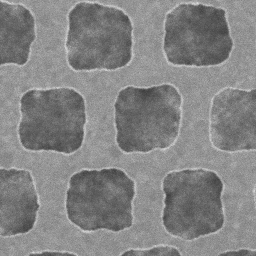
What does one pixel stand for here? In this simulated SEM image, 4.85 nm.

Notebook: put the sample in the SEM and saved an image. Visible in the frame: holes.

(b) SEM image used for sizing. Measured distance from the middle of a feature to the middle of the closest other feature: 454 nm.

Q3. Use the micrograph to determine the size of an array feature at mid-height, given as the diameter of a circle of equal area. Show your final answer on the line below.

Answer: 339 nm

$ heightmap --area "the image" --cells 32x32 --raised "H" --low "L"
LLHHHHHHHHLLLHHHHHHHHHHLHHHHHHHH
LLLLHHHHHLLLLLLHHHHHHLLLLLLLHHHH
LLLLHHHHHLLLLLLLHHHHHLLLLLLLHHHH
LLLLHHHHHLLLLLLLLHHHHLLLLLLLLHHH
LLLLHHHHLLLLLLLLLHHHLLLLLLLLLHHH
LLLLHHHHLLLLLLLLLHHHLLLLLLLLLHHH
LLLLHHHHLLLLLLLLLHHHHLLLLLLLLHHH
LLLHHHHHLLLLLLLLHHHHHLLLLLLLHHHH
HHHHHHHHHLLLLLLHHHHHHHHHHHHHHHHH
HHHHHHHHHHHHHHHHHHHHHHHHHHHHHHHH
HHHHHHHHHHHHHHHHHHHHHHHHHHHHHHHH
HHHLLLLLLLHHHHHLLLLLLLHHHHHLLLLL
HHHLLLLLLLLHHHLLLLLLLLLHHHHLLLLL
HHLLLLLLLLLHHHLLLLLLLLLHHHLLLLLL
HHHLLLLLLLLHHHLLLLLLLLLHHHLLLLLL
HHLLLLLLLLLHHHLLLLLLLLLHHHLLLLLL
HHLLLLLLLLLHHHHLLLLLLLHHHHLLLLLL
HHLLLLLLLLHHHHHLLLLLLLHHHHLLLLLL
HHHLLLLLLLHHHHHLLLLLHHHHHHHLLLLL
HHHHHHHHHHHHHHHHHHHHHHHHHHHHHHHH
HHHHHHHHHHHHHHHHHHHHHHHHHHHHHHHH
LLLHHHHHHHLLLLLLHHHHHLLLLLLHHHHH
LLLLHHHHHLLLLLLLLHHHLLLLLLLLHHHH
LLLLHHHHLLLLLLLLLHHHLLLLLLLLHHHH
LLLLLHHHLLLLLLLLLHHHHLLLLLLLHHHH
LLLLLHHHLLLLLLLLHHHHHLLLLLLLHHHH
LLLLLHHHLLLLLLLLLHHHLLLLLLLLHHHH
LLLLLHHHHLLLLLLLLHHHLLLLLLLLHHHH
LLLLHHHHHHLLLLLLHHHHHLLLLLLLHHHH
LLHHHHHHHHHHHHHHHHHHHHLLLHHHHHHH
HHHHHHHHHHHHHHHHHHHHHHHHHHHHHHHH
HHHHHLLLHHHHHHHHLLLLLLHHHHHHLLLL